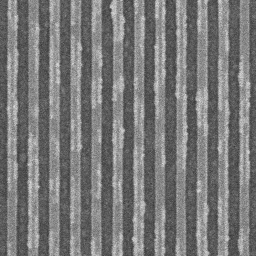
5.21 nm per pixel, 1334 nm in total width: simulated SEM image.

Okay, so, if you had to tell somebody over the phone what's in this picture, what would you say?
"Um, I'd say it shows parallel lines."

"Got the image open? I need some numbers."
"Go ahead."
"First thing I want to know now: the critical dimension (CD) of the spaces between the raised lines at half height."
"63.8 nm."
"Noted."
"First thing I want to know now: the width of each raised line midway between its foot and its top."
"46.2 nm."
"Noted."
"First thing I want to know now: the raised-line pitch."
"110 nm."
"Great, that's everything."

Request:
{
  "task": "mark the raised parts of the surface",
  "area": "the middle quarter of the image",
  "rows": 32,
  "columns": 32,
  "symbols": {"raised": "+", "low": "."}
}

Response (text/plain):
..++...++....+....++...++...+++.
..++...++....+....++...++...++..
..++...++....+....++...++...++..
..++...++....++...++...++...++..
..++...++....++...++...++...++..
..++...++...+++...++...++...++..
..++...++...+++...++...++...++..
..++...++...++....++...++...+++.
..++...++...++....++...++...+++.
..++...++...++....++...++...+++.
..++...++....+....++...++...+++.
..++...++....+....++...++...+++.
..++...++....+....++...++...+++.
..++...++....+....++...++...+++.
..++...++....+....++...++...+++.
..++...++...++....++...++...+++.
..++...++...+++...++...++...+++.
..++...++...+++...++...++...+++.
..++...++...+++...++...++...+++.
..++...++...+++...++...++...+++.
..++...++...+++...++...++...++..
..++...++...++....++...++...+++.
..++...++...++....++...++...++..
..++...++...++....++...++...++..
..++...++...++....++...++...++..
..++...++...++...+++...++...++..
..++...++...++....++...++...++..
..++...++...++....++...++...++..
..++...++...++....++...++...++..
..++...++...++....++...++...++..
..++...++...++....++...++...++..
..++...++...++....++...++...++..